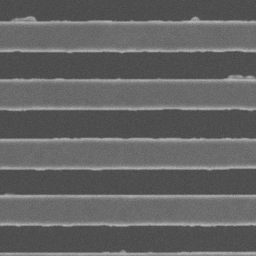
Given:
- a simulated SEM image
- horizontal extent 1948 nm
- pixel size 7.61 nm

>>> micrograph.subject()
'lines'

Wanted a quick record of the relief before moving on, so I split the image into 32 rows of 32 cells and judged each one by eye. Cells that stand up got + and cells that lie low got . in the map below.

................................
................................
................................
++++++++++++++++++++++++++++++++
++++++++++++++++++++++++++++++++
++++++++++++++++++++++++++++++++
...............+................
................................
................................
................................
++++++++++++++++++++++++++++++++
++++++++++++++++++++++++++++++++
++++++++++++++++++++++++++++++++
++++++++++++++++++++++++++++++++
................................
................................
................................
++++++++++++++++++++++++++++++++
++++++++++++++++++++++++++++++++
++++++++++++++++++++++++++++++++
++++++++++++++++++++++++++++++++
................................
................................
................................
+.++++++++++++++++++++++++++++++
++++++++++++++++++++++++++++++++
++++++++++++++++++++++++++++++++
++++++++++++++++++++++++++++++++
................................
................................
................................
................................